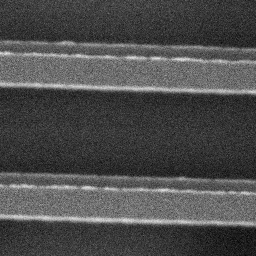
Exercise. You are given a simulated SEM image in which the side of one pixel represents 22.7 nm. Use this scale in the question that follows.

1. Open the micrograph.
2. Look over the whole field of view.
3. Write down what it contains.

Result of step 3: lines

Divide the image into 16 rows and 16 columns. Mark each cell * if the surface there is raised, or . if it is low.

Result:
................
................
................
****************
****************
........********
................
................
................
................
................
****************
****************
****************
................
................